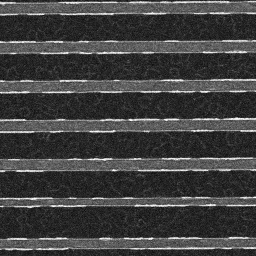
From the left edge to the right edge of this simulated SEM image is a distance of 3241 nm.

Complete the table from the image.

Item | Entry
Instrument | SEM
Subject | parallel lines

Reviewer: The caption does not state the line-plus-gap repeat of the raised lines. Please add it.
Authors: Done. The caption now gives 493 nanometers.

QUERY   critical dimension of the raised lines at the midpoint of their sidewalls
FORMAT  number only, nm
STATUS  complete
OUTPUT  362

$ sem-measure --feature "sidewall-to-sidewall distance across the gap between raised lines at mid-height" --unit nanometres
133